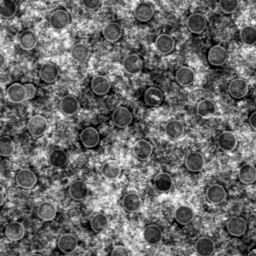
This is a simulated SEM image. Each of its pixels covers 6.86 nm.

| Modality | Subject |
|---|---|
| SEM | a regular array of raised bodies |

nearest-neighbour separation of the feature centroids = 259 nm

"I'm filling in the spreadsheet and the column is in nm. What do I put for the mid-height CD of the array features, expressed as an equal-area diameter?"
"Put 128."